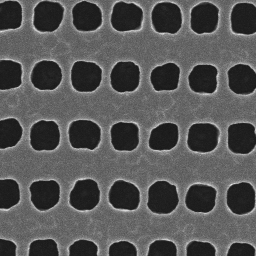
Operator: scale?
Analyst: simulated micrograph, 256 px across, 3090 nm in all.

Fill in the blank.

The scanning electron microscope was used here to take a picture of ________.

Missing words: a regular array of holes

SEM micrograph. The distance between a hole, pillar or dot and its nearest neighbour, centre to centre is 38.8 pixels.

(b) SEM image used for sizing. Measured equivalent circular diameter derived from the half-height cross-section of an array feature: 377 nanometres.